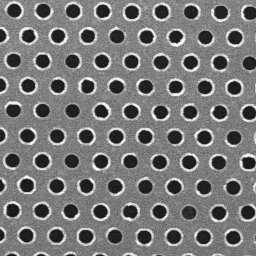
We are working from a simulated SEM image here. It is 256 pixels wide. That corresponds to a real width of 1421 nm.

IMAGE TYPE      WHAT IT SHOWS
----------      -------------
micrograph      a regular array of holes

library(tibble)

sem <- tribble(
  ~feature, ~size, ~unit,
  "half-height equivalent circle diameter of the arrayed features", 78.4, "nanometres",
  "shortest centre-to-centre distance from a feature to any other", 159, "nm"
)